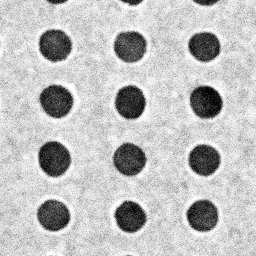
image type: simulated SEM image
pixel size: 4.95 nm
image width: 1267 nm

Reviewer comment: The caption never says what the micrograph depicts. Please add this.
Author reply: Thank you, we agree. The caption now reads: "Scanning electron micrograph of a regular array of holes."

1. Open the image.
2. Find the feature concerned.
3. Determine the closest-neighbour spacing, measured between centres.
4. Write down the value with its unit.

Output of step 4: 0.277 micrometres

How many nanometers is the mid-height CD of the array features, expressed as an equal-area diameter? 166